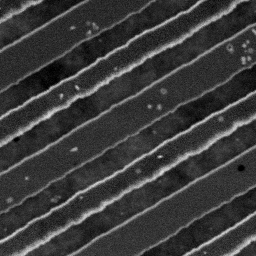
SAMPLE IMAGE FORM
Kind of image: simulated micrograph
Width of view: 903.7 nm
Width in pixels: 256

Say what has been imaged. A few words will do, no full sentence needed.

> lines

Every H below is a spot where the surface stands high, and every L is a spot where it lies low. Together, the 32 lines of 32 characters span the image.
HHHHLLLLLLHHHHHHHHHLLLLLLHHHHLLL
HHLLLLLLHHHHHHHHHLLLLLLHHHHHLLLL
LLLLLLHHHHHHHHHHLLLLLHHHHHLLLLLL
LLLLLHHHHHHHHHLLLLLHHHHHHLLLLLLH
LLLHHHHHHHHHLLLLLHHHHHHLLLLLLHHH
LHHHHHHHHHLLLLLLHHHHHHLLLLLHHHHH
HHHHHHHHHLLLLLHHHHHHLLLLLLHHHHHH
HHHHHHHLLLLLHHHHHHLLLLLLHHHHHHHH
HHHHHLLLLLLHHHHHLLLLLLHHHHHHHHHL
HHHLLLLLLHHHHHLLLLLLLHHHHHHHHLLL
HHLLLLLHHHHHHLLLLLLHHHHHHHHHLLLL
LLLLLLHHHHHLLLLLLHHHHHHHHHLLLLLL
LLLLHHHHHLLLLLLLHHHHHHHHLLLLLLHH
LLHHHHHLLLLLLLHHHHHHHHLLLLLLHHHH
HHHHHHLLLLLLHHHHHHHHHLLLLLHHHHHH
HHHHLLLLLLHHHHHHHHHLLLLLLHHHHHLL
HHHLLLLLLHHHHHHHHLLLLLLHHHHHHLLL
HLLLLLLHHHHHHHHHLLLLLHHHHHHLLLLL
LLLLLLHHHHHHHHLLLLLLHHHHHLLLLLLH
LLLLHHHHHHHHLLLLLLHHHHHLLLLLLLHH
LLHHHHHHHHHLLLLLHHHHHHLLLLLLHHHH
HHHHHHHHHLLLLLLHHHHHLLLLLLHHHHHH
HHHHHHHLLLLLLHHHHHHLLLLLHHHHHHHH
HHHHHHLLLLLHHHHHLLLLLLLHHHHHHHHH
HHHHLLLLLHHHHHHLLLLLLHHHHHHHHHLL
HHLLLLLLHHHHHLLLLLLHHHHHHHHHLLLL
HLLLLLHHHHHLLLLLLLHHHHHHHHLLLLLL
LLLLHHHHHHLLLLLLHHHHHHHHLLLLLLLH
LLLHHHHHLLLLLLHHHHHHHHHLLLLLLHHH
LHHHHHLLLLLLHHHHHHHHHHLLLLLHHHHH
HHHHHLLLLLLHHHHHHHHHLLLLLLHHHHHL
HHHLLLLLLHHHHHHHHHLLLLLLHHHHHLLL